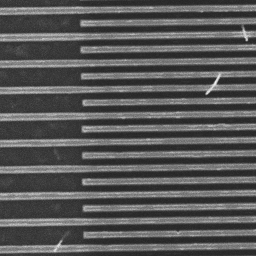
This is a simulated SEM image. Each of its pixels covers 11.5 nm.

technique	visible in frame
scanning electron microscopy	parallel lines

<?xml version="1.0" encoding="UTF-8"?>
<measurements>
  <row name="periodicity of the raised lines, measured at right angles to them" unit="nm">152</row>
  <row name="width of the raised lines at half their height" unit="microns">0.0688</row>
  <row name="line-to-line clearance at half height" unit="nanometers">80.3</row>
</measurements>